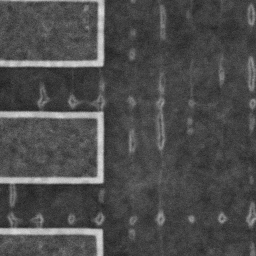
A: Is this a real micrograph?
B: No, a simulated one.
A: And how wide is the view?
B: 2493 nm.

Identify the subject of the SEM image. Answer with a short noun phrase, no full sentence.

wiring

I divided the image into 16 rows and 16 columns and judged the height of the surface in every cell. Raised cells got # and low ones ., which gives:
######..........
######..........
######..........
######..........
................
................
................
######..........
######..........
######..........
######..........
................
................
................
######..........
######..........